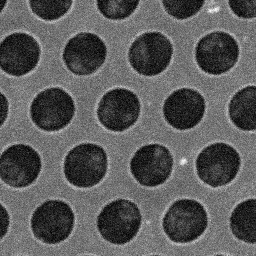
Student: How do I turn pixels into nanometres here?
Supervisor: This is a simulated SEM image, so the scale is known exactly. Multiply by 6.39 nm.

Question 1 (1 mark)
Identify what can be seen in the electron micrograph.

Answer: a regular array of holes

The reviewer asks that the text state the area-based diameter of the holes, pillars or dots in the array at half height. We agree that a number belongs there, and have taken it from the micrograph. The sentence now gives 287 nanometers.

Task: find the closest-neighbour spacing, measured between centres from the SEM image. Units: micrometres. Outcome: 0.414